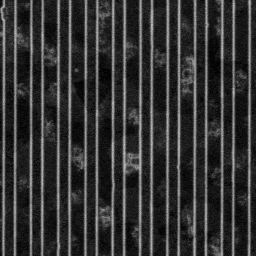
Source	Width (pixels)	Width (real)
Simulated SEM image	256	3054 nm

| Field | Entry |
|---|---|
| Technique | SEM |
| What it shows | parallel lines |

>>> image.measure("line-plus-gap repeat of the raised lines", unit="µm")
0.326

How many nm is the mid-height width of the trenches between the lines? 134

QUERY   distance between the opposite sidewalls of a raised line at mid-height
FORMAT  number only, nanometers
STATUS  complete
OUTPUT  191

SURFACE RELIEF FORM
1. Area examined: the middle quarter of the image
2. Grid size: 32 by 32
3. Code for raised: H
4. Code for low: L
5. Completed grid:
LLHHHLLLHHHHLLLHHHHLLLHHHHLLLHHH
LLHHHLLLHHHHLLLHHHHLLLHHHHLLLHHH
LLHHHLLLHHHHLLLHHHHLLLHHHHLLLHHH
LLHHHLLLHHHHLLLHHHHLLLHHHHLLLHHH
LLHHHLLLHHHHLLLHHHHLLLHHHHLLLHHH
LLHHHLLLHHHHLLLHHHHLLLHHHHLLLHHH
LLHHHLLLHHHHLLLHHHHLLLHHHHLLLHHH
LLHHHLLLHHHHLLLHHHHLLLHHHHLLLHHH
LLHHHLLLHHHHLLLHHHHLLLHHHHLLLHHH
LLHHHLLLHHHHLLLHHHHLLLHHHHLLLHHH
LLHHHLLLHHHHLLLHHHHLLLHHHHLLLHHH
LLHHHLLLHHHHLLLHHHHLLLHHHHLLLHHH
LLHHHLLLHHHHLLLHHHHLLLHHHHLLLHHH
LLHHHLLLHHHHLLLHHHHLLLHHHHLLLHHH
LLHHHLLLHHHHLLLHHHHLLLHHHHLLLHHH
LLHHHLLLHHHHLLLHHHHLLLHHHHLLLHHH
LLHHHLLLHHHHLLLHHHHLLLHHHHLLLHHH
LHHHHLLLHHHHLLLHHHHLLLHHHHLLLHHH
LHHHHLLLHHHHLLLHHHHLLLHHHHLLLHHH
LLHHHLLLHHHHLLLHHHHLLLHHHHLLLHHH
LLHHHLLLHHHHLLLHHHHLLLHHHHLLLHHH
LHHHHLLLHHHHLLLHHHHLLLHHHHLLLHHH
LHHHHLLLHHHHLLLHHHHLLLHHHHLLLHHH
LHHHHLLLHHHHLLLHHHHLLLHHHHLLLHHH
LHHHHLLLHHHHLLLHHHHLLLHHHHLLLHHH
LHHHHLLLHHHHLLLHHHHLLLHHHHLLLHHH
LHHHHLLLHHHHLLLHHHHLLLHHHHLLLHHH
LHHHHLLLHHHHLLLHHHHLLLHHHHLLLHHH
LHHHHLLLHHHHLLLHHHHLLLHHHHLLLHHH
LHHHHLLLHHHHLLLHHHHLLLHHHHLLLHHH
LHHHHLLLHHHHLLLHHHHLLLHHHHLLLHHH
LHHHHLLLHHHHLLLHHHHLLLHHHHLLLHHH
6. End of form